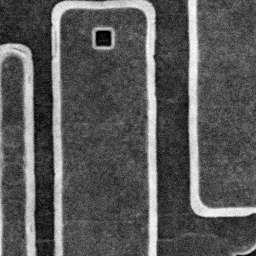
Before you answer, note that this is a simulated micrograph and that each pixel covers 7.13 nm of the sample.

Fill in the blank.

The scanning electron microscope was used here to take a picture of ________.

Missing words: wiring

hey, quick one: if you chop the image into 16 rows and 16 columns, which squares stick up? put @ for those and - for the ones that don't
----@@@@@---@@@@
---@@@@@@---@@@@
----@@-@@---@@@@
@@--@@@@@---@@@@
@@-@@@@@@---@@@@
@@-@@@@@@---@@@@
@@--@@@@@@--@@@@
@@--@@@@@@--@@@@
@@--@@@@@@--@@@@
@@--@@@@@@--@@@@
@@--@@@@@@--@@@@
@@--@@@@@@--@@@@
@@--@@@@@@--@@@@
@@--@@@@@@------
@@--@@@@@@------
@@--@@@@@@------